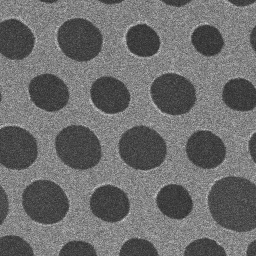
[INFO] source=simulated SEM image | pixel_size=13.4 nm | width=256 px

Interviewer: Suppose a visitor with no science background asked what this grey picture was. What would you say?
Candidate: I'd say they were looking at a regular array of holes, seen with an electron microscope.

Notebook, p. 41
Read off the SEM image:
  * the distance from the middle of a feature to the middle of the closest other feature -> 0.822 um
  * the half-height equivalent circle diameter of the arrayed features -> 39.4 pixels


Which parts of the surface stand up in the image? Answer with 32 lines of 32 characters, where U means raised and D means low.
UUUUUUUUUUUUUUUUUUUUUDDUUUUUUDDU
UUUUUUUUUUUUUUUUUUUUUUUUUUUUUUUU
UDUUUUUUUDDUUUUUUUUUUUUUUUUUUUUU
DDDDUUUDDDDDUUUUDDDUUUUUUDDUUUUU
DDDDUUUDDDDDDUUUDDDDUUUUDDDDUUUD
DDDDUUUDDDDDDUUUDDDDUUUUDDDDUUUD
DDDDUUUUDDDDUUUUDDDDUUUUUDDUUUUU
UUDUUUUUUDDUUUUUUUUUUUUUUUUUUUUU
UUUUUUUUUUUUUUUUUUUUUUUUUUUUUUUU
UUUUUDDUUUUUUUUUUUUUDDDUUUUUUUUU
UUUUDDDDUUUUDDDUUUUDDDDDUUUUDDDD
UUUUDDDDDUUDDDDDUUUDDDDDUUUUDDDD
UUUUDDDDDUUDDDDDUUUDDDDDUUUUDDDD
UUUUUDDDUUUUDDDDUUUUDDDDUUUUUDDD
UUUUUUUUUUUUUUUUUUUUUUUUUUUUUUUU
UUUUUUUUUUUUUUUUUUUUUUUUUUUUUUUU
DDDDUUUDDDDDUUUUDDDDUUUUDDDUUUUU
DDDDUUUDDDDDUUUDDDDDDUUUDDDDUUUD
DDDDDUUDDDDDDUUDDDDDDUUDDDDDUUUD
DDDDDUUDDDDDDUUDDDDDDUUDDDDDUUUD
DDDDUUUUDDDDUUUUDDDDUUUUDDDDUUUU
UUUUUUUUUUUUUUUUUUUUUUUUUUUUUUUU
UUUUUDUUUUUUUUUUUUUUUUUUUUUDDDDU
UUUDDDDDUUUUDDDUUUUUDDDUUUDDDDDD
DUUDDDDDUUUDDDDDUUUUDDDDUUDDDDDD
DUUDDDDDDUUDDDDDUUUUDDDDUUDDDDDD
DUUDDDDDUUUUDDDDUUUUDDDDUUDDDDDD
DUUUDDDDUUUUUDDUUUUUUUUUUUUDDDDD
UUUUUUUUUUUUUUUUUUUUUUUUUUUUDDDD
UDUUUUUUUUUUUUUUUUUUUUUUUUUUUUUU
DDDDUUUUDDDUUUUDDDDUUUUUDDDUUUUD
DDDDUUUDDDDDUUUDDDDDUUUDDDDDUUUD